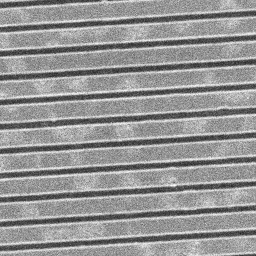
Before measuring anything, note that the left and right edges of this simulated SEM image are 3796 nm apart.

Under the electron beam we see parallel lines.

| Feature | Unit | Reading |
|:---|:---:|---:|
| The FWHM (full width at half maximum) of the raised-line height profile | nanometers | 255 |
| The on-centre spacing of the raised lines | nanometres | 360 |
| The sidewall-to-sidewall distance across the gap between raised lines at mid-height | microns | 0.0999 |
